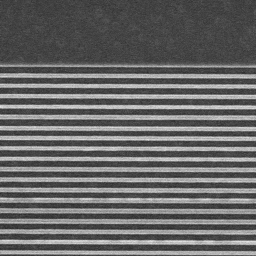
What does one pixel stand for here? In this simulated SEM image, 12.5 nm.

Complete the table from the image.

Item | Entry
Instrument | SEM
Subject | parallel lines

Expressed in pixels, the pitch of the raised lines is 10.4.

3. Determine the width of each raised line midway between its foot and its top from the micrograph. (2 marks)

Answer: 3.87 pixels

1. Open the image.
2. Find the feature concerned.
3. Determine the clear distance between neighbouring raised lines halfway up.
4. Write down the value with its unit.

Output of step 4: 82.9 nanometers